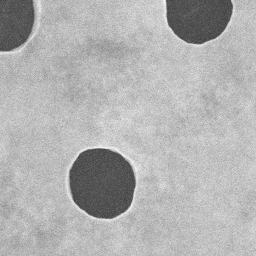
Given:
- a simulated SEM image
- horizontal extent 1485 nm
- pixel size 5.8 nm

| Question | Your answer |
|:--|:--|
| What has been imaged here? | holes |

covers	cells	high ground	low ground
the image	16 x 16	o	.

..oooooooo.....o
..ooooooooo...oo
..ooooooooo..ooo
oooooooooooooooo
oooooooooooooooo
oooooooooooooooo
oooooooooooooooo
oooooooooooooooo
oooooooooooooooo
ooooo..ooooooooo
oooo....oooooooo
oooo....oooooooo
ooooo...oooooooo
oooooo.ooooooooo
oooooooooooooooo
oooooooooooooooo